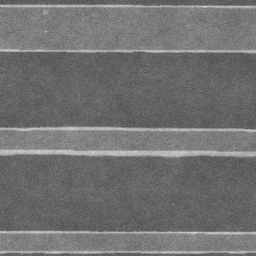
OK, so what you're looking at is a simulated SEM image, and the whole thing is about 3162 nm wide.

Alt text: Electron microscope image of lines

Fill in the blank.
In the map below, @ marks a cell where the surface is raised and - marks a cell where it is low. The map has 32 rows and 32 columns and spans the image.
--------------------------------
@@@@@@@@@@@@@@@@@@@@@@@@@@@@@@@@
@@@@@@@@@@@@@@@@@@@@@@@@@@@@@@@@
@@@@@@@@@@@@@@@@@@@@@@@@@@@@@@@@
@@@@@@@@@@@@@@@@@@@@@@@@@@@@@@@@
@@@@@@@@@@@@@@@@@@@@@@@@@@@@@@@@
--------------------------------
--------------------------------
--------------------------------
--------------------------------
--------------------------------
--------------------------------
--------------------------------
--------------------------------
--------------------------------
--------------------------------
@@@@@@@@@@@@@@@@@@@@@@@@@@@@@@@@
@@@@@@@@@@@@@@@@@@@@@@@@@@@@@@@@
@@@@@@@@@@@@@@@@@@@@@@@@@@@@@@@@
--------------------------------
--------------------------------
--------------------------------
--------------------------------
--------------------------------
--------------------------------
--------------------------------
--------------------------------
--------------------------------
--------------------------------
@@@@@@@@@@@@@@@@@@@@@@@@@@@@@@@@
@@@@@@@@@@@@@@@@@@@@@@@@@@@@@@@@
@@@@@@@@@@@@@@@@@@@@@@@@@@@@@@@@